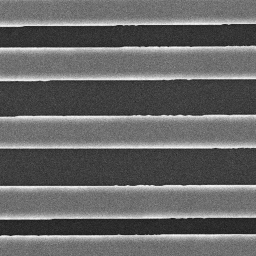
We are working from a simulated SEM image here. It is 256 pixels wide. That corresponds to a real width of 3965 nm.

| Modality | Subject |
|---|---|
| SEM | lines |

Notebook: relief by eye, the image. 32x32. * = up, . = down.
********************************
********************************
********************************
................................
................................
................................
********************************
********************************
********************************
********************************
................................
................................
................................
................................
.................**.*.*..*******
********************************
********************************
********************************
................................
................................
................................
................................
................................
********************************
********************************
********************************
********************************
................................
................................
********************************
********************************
********************************